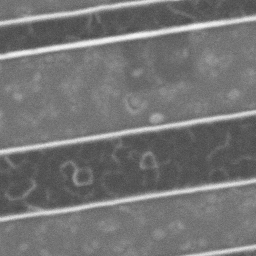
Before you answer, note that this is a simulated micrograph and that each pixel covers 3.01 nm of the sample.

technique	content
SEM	one or a few lines or trenches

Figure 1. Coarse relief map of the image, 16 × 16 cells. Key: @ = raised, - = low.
------@@@@@@@@@@
@@@@@@@@@@@@@@--
@@@@@@@---------
@---------------
----------------
----------------
----------------
-------------@@@
------@@@@@@@@@@
@@@@@@@@@@@@@@@@
@@@@@@@@@@@@@@@@
@@@@@@@@@@@@@@@-
@@@@@@@@--------
@@--------------
----------------
---------------@